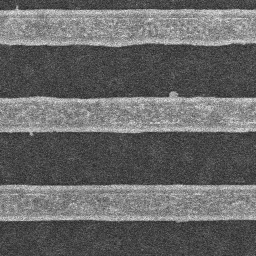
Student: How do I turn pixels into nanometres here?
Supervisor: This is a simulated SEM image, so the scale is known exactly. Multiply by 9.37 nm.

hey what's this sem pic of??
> one or a few lines or trenches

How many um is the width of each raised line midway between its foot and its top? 0.289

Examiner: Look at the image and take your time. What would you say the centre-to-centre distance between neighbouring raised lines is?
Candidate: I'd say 821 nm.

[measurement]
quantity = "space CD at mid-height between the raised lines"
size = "0.536 µm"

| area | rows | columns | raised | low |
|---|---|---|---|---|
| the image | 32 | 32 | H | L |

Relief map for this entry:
LLLLLLLLLLLLLLLLLLLLLLLLLLLLLLLL
LLHLLLLLLLLLLLLLLLLLLLLLLLLLLLLL
HHHHHHHHHHHHHHHHHHHHHHHHHHHHHHHH
HHHHHHHHHHHHHHHHHHHHHHHHHHHHHHHH
HHHHHHHHHHHHHHHHHHHHHHHHHHHHHHHH
LLLLLLLLLLLLLHHHLLLLLLLLLLLLLLLL
LLLLLLLLLLLLLLLLLLLLLLLLLLLLLLLL
LLLLLLLLLLLLLLLLLLLLLLLLLLLLLLLL
LLLLLLLLLLLLLLLLLLLLLLLLLLLLLLLL
LLLLLLLLLLLLLLLLLLLLLLLLLLLLLLLL
LLLLLLLLLLLLLLLLLLLLLLLLLLLLLLLL
LLLLLLLLLLLLLLLLLLLLLLLLLLLLLLLL
LLLHHHHLLLLLLLLLLHHLLLLLHHHLLLLL
HHHHHHHHHHHHHHHHHHHHHHHHHHHHHHHH
HHHHHHHHHHHHHHHHHHHHHHHHHHHHHHHH
HHHHHHHHHHHHHHHHHHHHHHHHHHHHHHHH
LLLLLLLLLLLLLLLLLLLLLLLLLLLLLLLL
LLLLLLLLLLLLLLLLLLLLLLLLLLLLLLLL
LLLLLLLLLLLLLLLLLLLLLLLLLLLLLLLL
LLLLLLLLLLLLLLLLLLLLLLLLLLLLLLLL
LLLLLLLLLLLLLLLLLLLLLLLLLLLLLLLL
LLLLLLLLLLLLLLLLLLLLLLLLLLLLLLLL
LLLLLLLLLLLLLLLLLLLLLLLLLLLLLLLL
HHHHHLLLLHHHHHHHHHHHHHHHHHHHHHHH
HHHHHHHHHHHHHHHHHHHHHHHHHHHHHHHH
HHHHHHHHHHHHHHHHHHHHHHHHHHHHHHHH
HHHHHHHHHHHHHHHHHHHHHHHHHHHHHHHH
LLLLLLLLLLLLLLLLLLLLLLLLLLLLLLLL
LLLLLLLLLLLLLLLLLLLLLLLLLLLLLLLL
LLLLLLLLLLLLLLLLLLLLLLLLLLLLLLLL
LLLLLLLLLLLLLLLLLLLLLLLLLLLLLLLL
LLLLLLLLLLLLLLLLLLLLLLLLLLLLLLLL